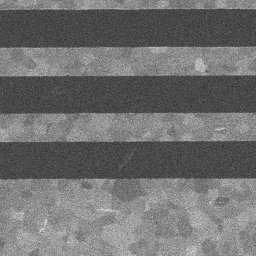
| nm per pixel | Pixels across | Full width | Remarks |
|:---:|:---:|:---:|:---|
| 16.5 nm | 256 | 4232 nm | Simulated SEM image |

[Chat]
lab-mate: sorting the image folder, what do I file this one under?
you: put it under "one or a few lines or trenches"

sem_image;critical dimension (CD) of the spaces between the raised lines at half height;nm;632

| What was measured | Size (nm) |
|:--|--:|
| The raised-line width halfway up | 454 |